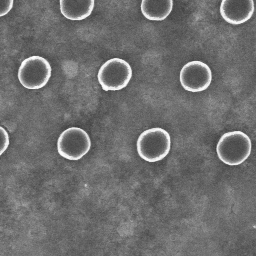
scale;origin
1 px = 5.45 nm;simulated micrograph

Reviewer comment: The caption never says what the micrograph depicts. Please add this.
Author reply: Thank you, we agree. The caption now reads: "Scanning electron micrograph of raised bodies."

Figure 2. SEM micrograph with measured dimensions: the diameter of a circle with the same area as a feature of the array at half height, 176 nm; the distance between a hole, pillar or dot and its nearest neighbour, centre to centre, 80.1 pixels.